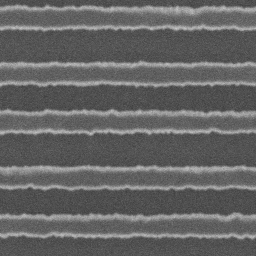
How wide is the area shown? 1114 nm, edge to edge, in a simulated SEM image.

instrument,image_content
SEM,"lines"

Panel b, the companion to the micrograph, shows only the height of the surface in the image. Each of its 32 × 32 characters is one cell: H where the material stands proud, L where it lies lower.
LLLLLLLLLLLLLLLLLLLLLLLLLLLLLLLL
HHHHHHHHHHHHHHHHHHHHHHHHHHHHHHHH
HHHHHHHHHHHHHHHHHHHHHHHHHHHHHHHH
HHHHHHHHHHLHHLHHHLHHLHHHHHHHHHHH
LLLLLLLLLLLLLLLLLLLLLLLLLLLLLLLL
LLLLLLLLLLLLLLLLLLLLLLLLLLLLLLLL
LLLLLLLLLLLLLLLLLLLLLLLLLLLLLLLL
LLLLLLLLLLLLLLLLLLLLLLLLLLLLLLLL
HHHHHHHHHHHHHHHHHHHHHHHHHHHHHHHH
HHHHHHHHHHHHHHHHHHHHHHHHHHHHHHHH
HLHLHHHLLHHLLLLLHHHHHHHHHHHLLLLH
LLLLLLLLLLLLLLLLLLLLLLLLLLLLLLLL
LLLLLLLLLLLLLLLLLLLLLLLLLLLLLLLL
LLLLLLLLLLLLLLLLLLLLLLLLLLLLLLLL
HHHHHHHHHHHHHHHHHHHHHHHHHHHHHHHH
HHHHHHHHHHHHHHHHHHHHHHHHHHHHHHHH
HHHHHHHHHHHHHHHHHLHHHHHHHHLHHHHH
LLLLLLLLLLLLLLLLLLLLLLLLLLLLLLLL
LLLLLLLLLLLLLLLLLLLLLLLLLLLLLLLL
LLLLLLLLLLLLLLLLLLLLLLLLLLLLLLLL
LLLLLLLLLLLLLLLLLLLLLLLLLLLLLLLL
HHHHHHHHHHHHHHHHHHHHHHHHHHHHHHHH
HHHHHHHHHHHHHHHHHHHHHHHHHHHHHHHH
HHHLHHLHHHHHHHHHHHHHHHHLHHHHHLHH
LLLLLLLLLLLLLLLLLLLLLLLLLLLLLLLL
LLLLLLLLLLLLLLLLLLLLLLLLLLLLLLLL
LLLLLLLLLLLLLLLLLLLLLLLLLLLLLLLL
HHHHHHHHHHHHHHHHHHHHHHHHHHHHHHHH
HHHHHHHHHHHHHHHHHHHHHHHHHHHHHHHH
HLLLHHLHLHHHHHHHHLHHHHHHHHHHHHHH
LLLLLLLLLLLLLLLLLLLLLLLLLLLLLLLL
LLLLLLLLLLLLLLLLLLLLLLLLLLLLLLLL